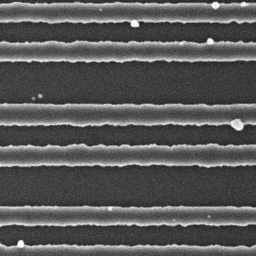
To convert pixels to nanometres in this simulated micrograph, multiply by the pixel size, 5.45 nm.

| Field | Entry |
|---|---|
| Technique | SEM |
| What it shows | lines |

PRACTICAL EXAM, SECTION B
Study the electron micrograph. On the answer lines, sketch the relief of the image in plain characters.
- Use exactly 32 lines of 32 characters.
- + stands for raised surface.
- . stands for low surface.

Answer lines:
.+++++++++++.+++++++++++++++++++
++++++++++++++++++++++++++++++++
++++++++++++++++++++++++++++++++
................................
................................
++++++++++++++++++++++++++++++++
++++++++++++++++++++++++++++++++
++++++++++++++++++++++++++++++..
................................
................................
................................
................................
................................
++++++++++++++++++++++++++++++++
++++++++++++++++++++++++++++++++
+++++++++++++.+++++++.++++++++++
................................
................................
++++++++++++++++++++++++++++++++
++++++++++++++++++++++++++++++++
++++++++++++++++++++++++++++++++
................................
................................
................................
................................
................................
++++++++++++++++++++++++++++++++
++++++++++++++++++++++++++++++++
................................
................................
..+.............................
++++++++++++++++++++++++++++++++